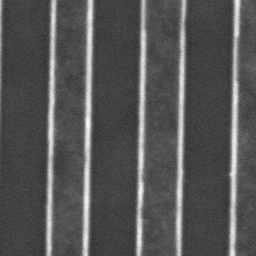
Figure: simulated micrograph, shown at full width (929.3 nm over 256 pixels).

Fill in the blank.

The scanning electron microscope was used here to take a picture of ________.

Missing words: one or a few lines or trenches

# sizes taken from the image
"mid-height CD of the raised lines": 148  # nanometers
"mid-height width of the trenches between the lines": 187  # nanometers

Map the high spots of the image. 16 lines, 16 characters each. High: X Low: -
---XXX---XX----X
---XXX---XX----X
---XXX---XX----X
---XXX---XX----X
---XXX---XX----X
---XXX---XX----X
---XXX---XX----X
---XXX---XX----X
---XXX---XX----X
---XXX---XX----X
---XXX---XX----X
---XX----XX----X
---XX----XX----X
---XX----XX---XX
---XX----XX---XX
---XX----XX---XX